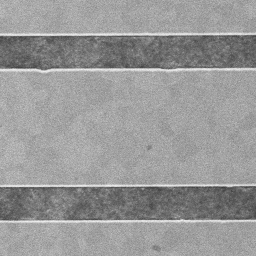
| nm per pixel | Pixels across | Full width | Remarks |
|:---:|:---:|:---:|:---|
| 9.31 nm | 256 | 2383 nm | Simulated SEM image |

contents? one or a few lines or trenches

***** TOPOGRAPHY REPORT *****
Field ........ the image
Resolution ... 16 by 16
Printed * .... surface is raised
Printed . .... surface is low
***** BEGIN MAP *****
****************
****************
................
................
****************
****************
****************
****************
****************
****************
****************
****************
................
................
****************
****************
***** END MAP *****